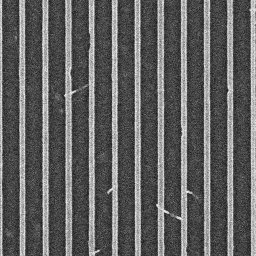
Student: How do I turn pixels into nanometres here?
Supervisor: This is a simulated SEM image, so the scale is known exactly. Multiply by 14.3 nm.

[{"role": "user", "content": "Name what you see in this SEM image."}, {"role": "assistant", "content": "parallel lines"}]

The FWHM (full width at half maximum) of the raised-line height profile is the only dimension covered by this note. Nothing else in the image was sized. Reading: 68 nm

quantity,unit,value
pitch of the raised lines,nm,330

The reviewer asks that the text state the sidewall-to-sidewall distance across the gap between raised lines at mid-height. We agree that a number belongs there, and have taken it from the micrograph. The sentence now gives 0.263 micrometres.